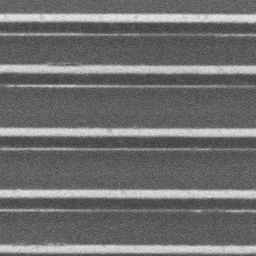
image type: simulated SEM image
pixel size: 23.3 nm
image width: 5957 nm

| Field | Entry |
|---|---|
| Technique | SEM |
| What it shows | lines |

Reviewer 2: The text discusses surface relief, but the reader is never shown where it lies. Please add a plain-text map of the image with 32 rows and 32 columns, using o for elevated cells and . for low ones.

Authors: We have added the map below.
................................
................................
oooooooooooooooooooooooooooooooo
oooooooooooooooooooooooooooooooo
................................
................................
................................
................................
................................
oooooooooooooooooooooooooooooooo
oooooooooooooooooooooooooooooooo
................................
................................
................................
................................
................................
ooooooo.........................
oooooooooooooooooooooooooooooooo
oooooooooooooooooooooooooooooooo
................................
................................
................................
................................
................................
oooooooooooooooooooooooooooooooo
oooooooooooooooooooooooooooooooo
................................
................................
................................
................................
................................
oooooooooooooooooooooooooooooooo